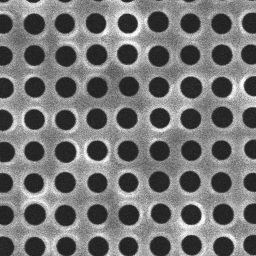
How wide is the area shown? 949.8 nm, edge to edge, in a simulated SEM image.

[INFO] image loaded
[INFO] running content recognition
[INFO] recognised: a regular array of holes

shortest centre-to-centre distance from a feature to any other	0.114	micrometres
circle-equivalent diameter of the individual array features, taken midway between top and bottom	77.8	nanometers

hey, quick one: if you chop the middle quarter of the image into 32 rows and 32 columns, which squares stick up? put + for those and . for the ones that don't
.++++++++++++++++++++++..+++++++
++++++++++++++++++++++++++++++++
++++++++++++++++++++++++++++++++
..+++++...+++++..+++++...+++++..
...+++.....+++....+++.....+++...
...+++.....+++.....++.....+++...
...+++.....+++.....++.....+++...
...+++....+++++...++++....++++..
.+++++++.++++++++++++++++++++++.
++++++++++++++++++++++++++++++++
++++++++++++++++++++++++++++++++
.++++++..+++++...+++++....++++..
..++++.....++.....++++....+++...
...++......++.....+++......++...
...+++.....++.....++++....+++...
...+++....++++....++++....++++..
.+++++++++++++++++++++++++++++++
++++++++++++++++++++++++++++++++
++++++++++++++++++++++++++++++++
.++++++...+++++..++++++..+++++..
...+++.....+++....++++....+++...
...+++.....++......++.....+++...
...+++.....++......+++....+++...
...++++...++++....++++....++++..
..++++++++++++++++++++++++++++++
++++++++++++++++++++++++++++++++
++++++++++++++++++++++++++++++++
..+++++...+++++..+++++....+++...
...+++....++++....+++.....+++...
...+++.....++......++.....+++...
...+++.....+++....+++.....+++...
..+++++...+++++...++++....++++..